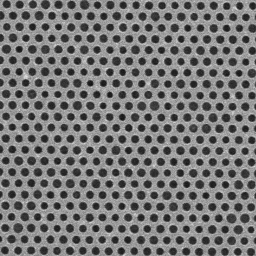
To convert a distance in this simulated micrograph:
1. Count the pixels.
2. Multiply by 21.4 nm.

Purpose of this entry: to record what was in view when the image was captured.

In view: a regular array of holes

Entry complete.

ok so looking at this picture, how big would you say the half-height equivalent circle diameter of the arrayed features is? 8.45 px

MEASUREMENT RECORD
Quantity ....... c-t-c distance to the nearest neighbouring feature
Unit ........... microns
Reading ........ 0.269